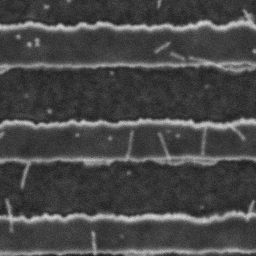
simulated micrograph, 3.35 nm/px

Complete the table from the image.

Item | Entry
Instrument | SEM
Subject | lines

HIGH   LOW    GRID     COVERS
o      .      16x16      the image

................
.oo...o.....o.oo
oooooooooooooooo
oooooooooooooooo
................
................
................
................
oooooooooooooooo
oooooooooooooooo
................
................
................
....ooo..ooo..oo
oooooooooooooooo
oooooooooooooooo